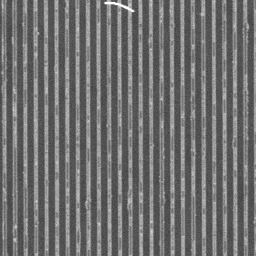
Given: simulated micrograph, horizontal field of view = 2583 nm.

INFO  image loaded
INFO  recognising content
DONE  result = parallel lines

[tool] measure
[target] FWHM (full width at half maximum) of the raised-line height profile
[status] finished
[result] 35.3 nanometres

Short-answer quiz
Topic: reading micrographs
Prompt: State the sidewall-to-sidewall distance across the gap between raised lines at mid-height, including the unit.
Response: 70.6 nanometres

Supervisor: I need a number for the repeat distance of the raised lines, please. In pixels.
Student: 10.5